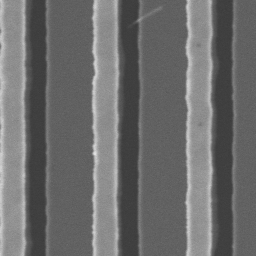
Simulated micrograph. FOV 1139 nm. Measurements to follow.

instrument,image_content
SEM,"lines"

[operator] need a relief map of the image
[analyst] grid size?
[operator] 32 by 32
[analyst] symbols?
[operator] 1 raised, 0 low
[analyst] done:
11100011111111100111111111100111
11100011111111100111111111100111
11100011111111100111111111100111
11100011111111100111111111100111
11100011111111100111111111100111
11100011111111100111111111100111
11100011111111100111111111000111
11100011111111100111111111100111
11100011111111100111111111100111
11100011111111100111111111100111
11100011111111100011111111000111
11100011111111100011111111000111
11100011111111100111111111000111
11100011111111100111111111100111
11100011111111100111111111100111
11100011111111100111111111100111
11100011111111100111111111000111
11100011111111100111111111100111
11100011111111100111111111000111
11100011111111100111111111100111
11100011111111100111111111100111
11100011111111100111111111100111
11100011111111100111111111100111
11100011111111100111111111100111
11100011111111100111111111100111
11100011111111100111111111100111
11100011111111100111111111100111
11100011111111100111111111100111
11100011111111100111111111100111
11100011111111100111111111100111
11100011111111100111111111100111
11100011111111100111111111000111